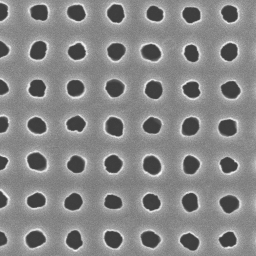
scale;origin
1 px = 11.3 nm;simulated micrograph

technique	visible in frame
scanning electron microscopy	a regular array of holes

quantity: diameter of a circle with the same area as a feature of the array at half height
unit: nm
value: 200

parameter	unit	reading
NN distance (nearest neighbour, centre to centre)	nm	420